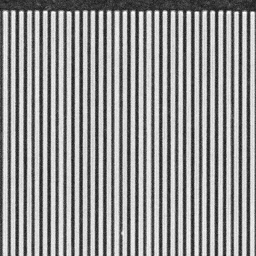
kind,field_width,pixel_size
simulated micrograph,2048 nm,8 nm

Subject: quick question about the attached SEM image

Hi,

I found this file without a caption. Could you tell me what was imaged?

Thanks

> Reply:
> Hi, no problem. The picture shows parallel lines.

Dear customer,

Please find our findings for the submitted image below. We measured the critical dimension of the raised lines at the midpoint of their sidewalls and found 29 nm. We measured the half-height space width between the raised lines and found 4.62 pixels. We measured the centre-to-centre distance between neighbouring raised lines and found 63.7 nanometers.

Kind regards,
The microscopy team